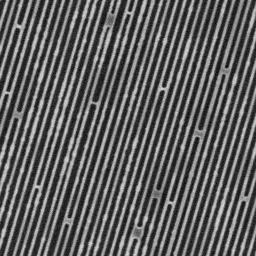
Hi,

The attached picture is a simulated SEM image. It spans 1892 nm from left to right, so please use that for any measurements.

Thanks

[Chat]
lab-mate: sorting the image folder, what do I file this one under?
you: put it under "parallel lines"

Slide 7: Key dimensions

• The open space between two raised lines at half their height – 38.2 nm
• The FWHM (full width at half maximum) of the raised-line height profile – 19.5 nm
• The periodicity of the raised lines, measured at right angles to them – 0.0576 µm